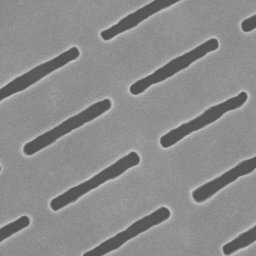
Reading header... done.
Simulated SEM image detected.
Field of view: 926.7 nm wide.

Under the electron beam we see holes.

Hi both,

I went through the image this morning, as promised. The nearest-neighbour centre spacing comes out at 221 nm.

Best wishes